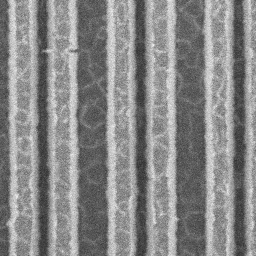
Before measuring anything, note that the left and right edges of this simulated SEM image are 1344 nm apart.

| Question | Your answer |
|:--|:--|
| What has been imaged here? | parallel lines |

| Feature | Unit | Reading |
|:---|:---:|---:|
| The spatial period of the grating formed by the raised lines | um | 0.258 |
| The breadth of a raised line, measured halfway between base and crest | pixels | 21.4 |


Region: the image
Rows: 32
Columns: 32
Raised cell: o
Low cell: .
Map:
..oo..ooo.....oo...oo.....ooo..o
..oo..ooo.....oo...oo.....ooo..o
..oo..ooo.....oo...oo.....ooo..o
..oo..ooo.....ooo..oo.....ooo..o
..oo..ooo.....ooo..oo.....ooo..o
..oo...oo.....oo...oo.....ooo..o
..oo..ooo.....oo...oo.....ooo..o
..oo...oo.....oo...oo.....ooo..o
..oo..ooo.....ooo..oo.....ooo..o
..oo..ooo.....oo...oo.....ooo..o
..oo..ooo.....oo...oo.....ooo..o
.ooo..ooo.....oo...oo.....ooo..o
..oo..ooo.....oo...oo.....ooo..o
..oo..ooo.....ooo..oo.....ooo..o
..oo..ooo.....oo...oo.....ooo..o
..oo..ooo.....oo...oo.....ooo..o
..oo..ooo.....oo...oo.....ooo..o
..oo..ooo.....ooo..oo.....ooo..o
..oo..ooo.....ooo..ooo....ooo..o
..oo...oo.....ooo..oo.....ooo..o
..oo...oo.....ooo..oo.....ooo..o
..oo...oo.....ooo..ooo....ooo..o
..oo...oo.....ooo..ooo....ooo..o
..oo...oo.....ooo..ooo....ooo..o
..oo...oo.....ooo..ooo....ooo..o
..oo...oo.....ooo..ooo....ooo..o
..oo...oo.....ooo..ooo....ooo..o
..oo...oo.....ooo..ooo....ooo..o
.ooo...oo.....ooo..ooo....ooo..o
..oo...oo.....ooo..oo.....ooo..o
..oo...oo.....ooo..ooo....ooo..o
..oo...oo.....ooo..ooo....ooo..o